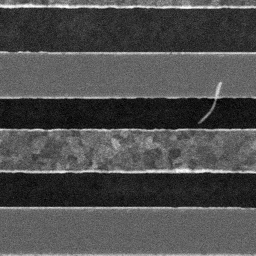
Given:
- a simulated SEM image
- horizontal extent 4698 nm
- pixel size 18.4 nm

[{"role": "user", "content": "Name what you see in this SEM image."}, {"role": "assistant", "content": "lines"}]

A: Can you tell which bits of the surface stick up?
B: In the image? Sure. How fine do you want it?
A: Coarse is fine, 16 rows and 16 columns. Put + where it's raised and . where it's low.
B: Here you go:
................
................
................
++++++++++++++++
++++++++++++++++
++++++++++++++++
................
................
++++++++++++++++
++++++++++++++++
++++++++++++++++
................
................
++++++++++++++++
++++++++++++++++
++++++++++++++++